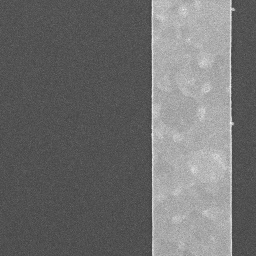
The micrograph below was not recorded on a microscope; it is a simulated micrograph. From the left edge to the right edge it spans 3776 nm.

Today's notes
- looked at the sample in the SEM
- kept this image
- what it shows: one or a few lines or trenches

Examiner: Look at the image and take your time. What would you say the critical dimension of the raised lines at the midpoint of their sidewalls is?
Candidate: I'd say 1170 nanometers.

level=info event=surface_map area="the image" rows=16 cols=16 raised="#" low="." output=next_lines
..........####..
..........####..
..........####..
..........####..
..........####..
..........####..
..........####..
..........####..
..........####..
..........####..
..........####..
..........####..
..........####..
..........####..
..........####..
..........####..